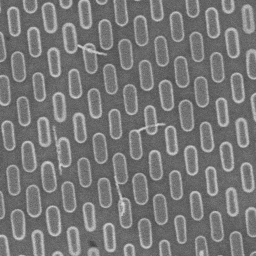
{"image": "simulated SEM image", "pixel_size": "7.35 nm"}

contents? groups of lines, slits or small figures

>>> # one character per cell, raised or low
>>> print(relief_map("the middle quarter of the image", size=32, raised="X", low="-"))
-----XXX--XX--XXX--XXX------XXX-
--X---XX--XXX------XXX------XXX-
-XXX------XXX------XXX------XXX-
-XXX------XXX------XXX------XXX-
--XX------XXX------XXX--XX--XXX-
--XX------XXX--XX--XXX--XXX--XX-
--XX--XX---XX--XXX--X---XXX-----
--XX--XXX------XXX------XXX-----
------XXX------XXX------XXX-----
------XXX------XXX------XXX--XXX
------XXX------XXX-------XX--XXX
-------XX-------XX--XXX--XX--XXX
-------XX--XXX------XXX------XXX
---XX------XXX------XXX------XXX
---XX-------XX------XXX------XXX
---XX-------XX------XXX------XXX
---XX-------XX-------XX--XXX--XX
---XX---XX--XX--XXX-------XX----
---XX--XXX--XX---XX-------XX----
X---X--XXX-------XX-------XX----
X------XXX-------XX-------XX----
X------XXXX------XX-------XX--XX
XX------XXX--X---XX--XXX---X--XX
XX------XXX-XXX--XX--XXX-------X
XX-XXX--XX--XXX------XXX-------X
X--XXX------XXXX-----XXX-------X
----XX-------XXX-----XXX-------X
----XX-------XXX------XX---XX--X
----XXX------XXX-XXX--XX--XXX---
XX--XXX--XX--XX--XXX-------XX---
XX---X---XX------XXXX------XX---
XXX------XXX------XXX------XX---